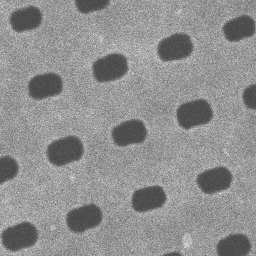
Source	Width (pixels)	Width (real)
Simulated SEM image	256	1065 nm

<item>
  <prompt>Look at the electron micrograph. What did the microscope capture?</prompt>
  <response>a regular array of holes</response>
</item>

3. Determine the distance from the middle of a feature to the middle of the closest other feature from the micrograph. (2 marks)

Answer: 279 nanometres